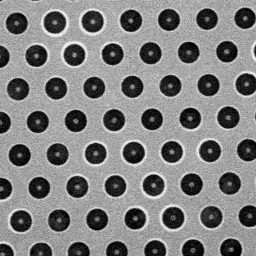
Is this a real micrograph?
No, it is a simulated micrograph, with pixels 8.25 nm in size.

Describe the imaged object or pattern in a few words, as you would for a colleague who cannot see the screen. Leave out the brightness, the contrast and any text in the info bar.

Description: an array of small figures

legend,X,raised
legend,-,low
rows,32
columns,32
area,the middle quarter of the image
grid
X--XXXXXXXXX-XXXXXXXXXXXXXXXXXXX
XXXXXXXXXXXXXXXXXXXXXXXXXXXXXXXX
XXXXXXXXXXXXXXXXXXXXXXXXXXXXXXXX
XXXXXX---XXXXXX----XXXXXX---XXXX
XXXXX-----XXXXX-----XXXX-----XXX
-XXXX-----XXXX------XXXX-----XXX
-XXXX-----XXXX------XXXX-----XXX
-XXXX-----XXXXX----XXXXXX----XXX
XXXXXX---XXXXXXX--XXXXXXXXXXXXXX
XXXXXXXXXXXXXXXXXXXXXXXXXXXXXXXX
XXXXXXXXXXXXXXXXXXXXXXXXXXXXXXXX
XX-XXXXXXXX---XXXXXX----XXXXXX--
X----XXXXX-----XXXXX----XXXXX---
------XXXX-----XXXX------XXXX---
------XXXX-----XXXX------XXXX---
-----XXXXX-----XXXXX----XXXXX---
X----XXXXXX---XXXXXXX--XXXXXXXX-
XXXXXXXXXXXXXXXXXXXXXXXXXXXXXXXX
XXXXXXXXXXXXXXXXXXXXXXXXXXXXXXXX
XXXXXXXXXXXXXXXX---XXXXXX----XXX
XXXXXX----XXXXX-----XXXXX-----XX
-XXXX------XXX------XXXX------XX
-XXXX------XXX------XXXX------XX
-XXXX------XXXX-----XXXX------XX
-XXXXX----XXXXXX---XXXXXXX---XXX
XXXXXXXXXXXXXXXXXXXXXXXXXXXXXXXX
XXXXXXXXXXXXXXXXXXXXXXXXXXXXXXXX
XXXXXXXXXXXXXXXXXXXXXX-XXXXXXX--
X----XXXXXX----XXXXX-----XXXX---
X-----XXXX------XXXX-----XXXX---
X-----XXXX------XXX------XXXX---
X-----XXXX-----XXXXX-----XXXX---